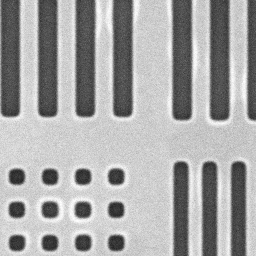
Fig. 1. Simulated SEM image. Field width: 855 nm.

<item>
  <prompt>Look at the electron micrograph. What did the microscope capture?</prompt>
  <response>groups of lines, slits or small figures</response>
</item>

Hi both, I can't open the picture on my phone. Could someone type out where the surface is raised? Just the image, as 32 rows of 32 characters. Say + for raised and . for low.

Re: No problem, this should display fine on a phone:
...++..++...++...++++...++...++.
...++..++...++...++++...++...++.
...++..++...++...++++...++...++.
...++..++...++...++++...++...++.
...++..++...++...++++...++...++.
...++..++...++...++++...++...++.
...++..++...++...++++...++...++.
...++..++...++...++++...++...++.
...++..++...++...++++...++...++.
...++..++...++...++++...++...++.
...++..++...++...++++...++...++.
...++..++...++...++++...++...++.
...++..++...++...++++...++...++.
...++..++...++...++++...++...++.
..+++..+++..++..++++++..++...++.
++++++++++++++++++++++++++++++++
++++++++++++++++++++++++++++++++
++++++++++++++++++++++++++++++++
++++++++++++++++++++++++++++++++
++++++++++++++++++++++++++++++++
++++++++++++++++++++++.++..++..+
+..++..++..++...++++++..+..++..+
+..++..++..++...++++++..+..++..+
+++++++++++++++++++++...+..++..+
++++++++++++++++++++++..+..++..+
+..++..++..+++.+++++++..+..++..+
+..++..++..+++..++++++..+..++..+
+++++++++++++++++++++...+..++..+
++++++++++++++++++++++..+..++..+
+..++..+++.+++.+++++++..+..++..+
+..++..++..++...++++++..+..++..+
+++++++++++++++++++++...+..++..+